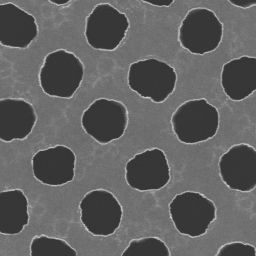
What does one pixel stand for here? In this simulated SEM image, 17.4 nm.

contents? a regular array of holes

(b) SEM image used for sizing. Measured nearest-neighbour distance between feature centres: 1100 nanometers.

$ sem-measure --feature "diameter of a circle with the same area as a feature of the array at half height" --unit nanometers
744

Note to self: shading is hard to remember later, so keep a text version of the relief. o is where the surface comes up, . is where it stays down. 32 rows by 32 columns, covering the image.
ooooooooooooooooooo..oooooooo..o
...ooooooooo...ooooooooo..oooooo
....ooooooo.....ooooooo....ooooo
.....oooooo.....ooooooo.....oooo
....ooooooo....oooooooo.....oooo
...oooooooo....oooooooo....ooooo
ooooooo.oooooooooooooooo..oooooo
oooooo....oooooooo.oooooooooo...
ooooo.....oooooo.....ooooooo....
ooooo.....oooooo......oooooo....
ooooo.....oooooo......oooooo....
oooooo...oooooooo....ooooooo....
oooooooooooo.oooooo.oooooooooooo
....ooooooo....oooooooo....ooooo
....oooooo......oooooo.....ooooo
....oooooo......oooooo.....ooooo
....ooooooo....ooooooo.....ooooo
oooooooooooo..ooooooooo...oooooo
ooooooo.ooooooooooooooooooooo..o
oooo.....oooooooo....ooooooo....
oooo.....ooooooo.....ooooooo....
oooo.....ooooooo.....ooooooo....
ooooo....ooooooo.....ooooooo....
ooooooooooooooooo...ooooooooo..o
...oooooooo...oooooooo...ooooooo
...ooooooo.....oooooo......ooooo
...ooooooo.....oooooo......ooooo
...ooooooo.....ooooooo.....ooooo
...oooooooo....ooooooo....oooooo
oooooooooooooooooooooooooooooooo
oooo....oooooooo....ooooooooo.oo
oooo.....ooooooo.....ooooooo....